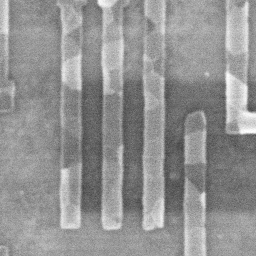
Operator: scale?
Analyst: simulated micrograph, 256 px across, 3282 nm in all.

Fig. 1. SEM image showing wiring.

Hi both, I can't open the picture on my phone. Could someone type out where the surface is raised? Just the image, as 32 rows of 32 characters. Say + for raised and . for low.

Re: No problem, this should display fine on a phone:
+......++++.++++..++........+++.
+.......++...++...++........+++.
+.......++...++...++........+++.
+.......++...++...++........+++.
+.......++...++...++........+++.
+.......++...++...++........+++.
+.......++...++...++........+++.
+.......++...++...++........+++.
+.......++...++...++........+++.
+.......++...++...++........+++.
++......++...++...++........+++.
++......++...++...++........+++.
++......++...++...++........+++.
++......++...++...++........+++.
........++...++...++....+...++++
........++...++...++...+++..++++
........++...++...++...+++...++.
........++...++...++...+++......
........++...++...++...+++......
........++...++...++...+++......
........++...++...++...+++......
........++...++...++...+++......
........++...++...++...++.......
........++...++...++...++.......
........++...++...++...++.......
........++...++...++...++.......
........++...++...++...++.......
........++...++...++...++.......
.............+....+....++.......
.......................+++......
.......................+++......
+......................+++......